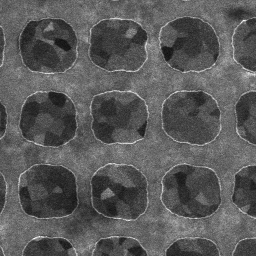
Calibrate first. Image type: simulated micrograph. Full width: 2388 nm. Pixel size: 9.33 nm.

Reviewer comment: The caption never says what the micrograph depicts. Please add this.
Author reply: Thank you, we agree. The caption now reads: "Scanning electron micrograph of a regular array of raised bodies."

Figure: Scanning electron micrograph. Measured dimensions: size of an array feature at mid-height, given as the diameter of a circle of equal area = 0.549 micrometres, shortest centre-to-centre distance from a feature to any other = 71.1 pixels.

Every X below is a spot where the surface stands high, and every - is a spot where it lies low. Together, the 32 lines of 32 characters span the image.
--------------------------------
--------------------------------
-----XXX-----XXX------XXX------X
---XXXXXX---XXXXXX--XXXXXXX---XX
X-XXXXXXXX-XXXXXXX--XXXXXXX--XXX
X-XXXXXXXX-XXXXXXX--XXXXXXX--XXX
X--XXXXXXX-XXXXXXX--XXXXXXX--XXX
---XXXXXX--XXXXXXX---XXXXXX--XXX
---XXXXXX----XXXX-----XXXX-----X
--------------------------------
--------------------------------
------X-------XX------XXXX-----X
---XXXXXX---XXXXXX---XXXXXX---XX
X--XXXXXX--XXXXXXX--XXXXXXX--XXX
X--XXXXXXX-XXXXXXX--XXXXXXXX--XX
X-XXXXXXXX-XXXXXXX--XXXXXXXX--XX
X--XXXXXXX--XXXXXX---XXXXXX---XX
---XXXXXX---XXXXX-----XXXXX----X
--------------------------------
--------------------------------
-----X--------------------------
---XXXXXX---XXXXXX---XXXXXX---XX
X-XXXXXXX--XXXXXXX--XXXXXXX--XXX
X-XXXXXXXX-XXXXXXX--XXXXXXXX-XXX
X-XXXXXXXX-XXXXXXX--XXXXXXXX-XXX
X--XXXXXXX--XXXXXX--XXXXXXXX-XXX
---XXXXXX---XXXXXX---XXXXXX---XX
----------------X---------------
--------------------------------
--------------------------------
---XXXXXX---XXXXXX---XXXXXX---XX
---XXXXXX---XXXXXX---XXXXXX--XXX